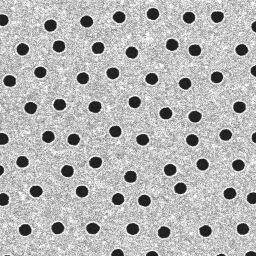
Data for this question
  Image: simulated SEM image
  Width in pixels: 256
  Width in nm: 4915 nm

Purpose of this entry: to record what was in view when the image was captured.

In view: a regular array of holes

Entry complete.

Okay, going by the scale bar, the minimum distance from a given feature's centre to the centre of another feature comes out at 558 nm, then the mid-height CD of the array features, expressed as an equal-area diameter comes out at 241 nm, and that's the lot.